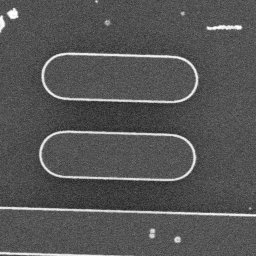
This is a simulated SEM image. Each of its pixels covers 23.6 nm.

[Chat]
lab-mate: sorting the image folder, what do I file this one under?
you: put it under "groups of lines, slits or small figures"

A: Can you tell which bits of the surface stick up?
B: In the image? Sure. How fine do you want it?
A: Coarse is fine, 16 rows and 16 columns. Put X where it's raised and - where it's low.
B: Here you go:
----------------
----------------
----------------
----XXXXX-------
---XXXXXXXXX----
---XXXXXXXXX----
----------------
----------------
---XXXXXXXX-----
---XXXXXXXXX----
---XXXXXXXXX----
----------------
----------------
XXXXXXXXXXXXXXXX
XXXXXXXXXXXXXXXX
XXXXXXXXXXXXXXXX